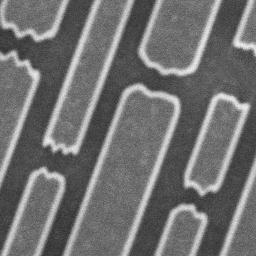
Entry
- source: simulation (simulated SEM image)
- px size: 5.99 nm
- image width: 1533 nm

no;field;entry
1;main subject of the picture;one or a few lines or trenches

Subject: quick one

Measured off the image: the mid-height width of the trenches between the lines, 172 nm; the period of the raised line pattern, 0.428 microns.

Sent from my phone